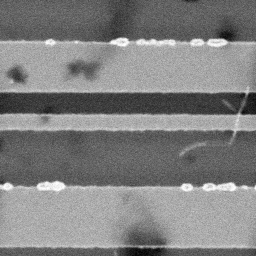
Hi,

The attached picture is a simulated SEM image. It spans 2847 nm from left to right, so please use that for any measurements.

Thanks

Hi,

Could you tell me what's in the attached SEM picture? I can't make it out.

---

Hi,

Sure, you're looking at lines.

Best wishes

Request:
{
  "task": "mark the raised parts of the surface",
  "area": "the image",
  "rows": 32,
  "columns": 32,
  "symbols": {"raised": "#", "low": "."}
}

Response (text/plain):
................................
................................
................................
................................
................................
################################
################################
################################
################################
################################
################################
..........................#...#.
................................
................................
################################
################################
................................
................................
................................
................................
................................
................................
................................
################################
################################
################################
################################
################################
################################
################################
################################
................................